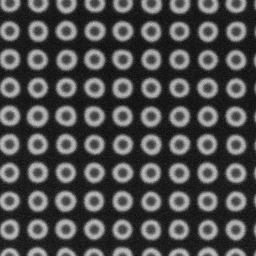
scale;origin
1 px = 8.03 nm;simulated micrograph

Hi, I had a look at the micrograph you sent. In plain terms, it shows an array of small figures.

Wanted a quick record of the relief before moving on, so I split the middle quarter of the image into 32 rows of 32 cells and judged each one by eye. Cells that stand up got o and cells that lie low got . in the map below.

ooo...oooo...ooo....oooo...oooo.
................................
................................
................................
oo....ooo....oooo...ooo....oooo.
ooo..ooooo..ooooo...oooo..ooooo.
ooo..ooooo..ooooo...oooo..ooooo.
oo....oooo...oooo...oooo...oooo.
................................
................................
................................
oo....ooo....ooo....ooo....oooo.
ooo..ooooo..ooooo..ooooo...oooo.
ooo..ooooo..ooooo..ooooo..ooooo.
ooo...oooo...oooo...oooo...oooo.
.....................o......oo..
................................
................................
oo....ooo....ooo....oooo...oooo.
ooo..ooooo...oooo..ooooo...oooo.
ooo..ooooo..ooooo..ooooo...oooo.
ooo...oooo...oooo...oooo...oooo.
.....................oo.........
................................
................................
oo....ooo....ooo....ooo....ooo..
ooo..ooooo..ooooo..ooooo..ooooo.
ooo..ooooo..ooooo..ooooo..ooooo.
oo....oooo...oooo..ooooo...oooo.
o......o.............o......oo..
................................
................................